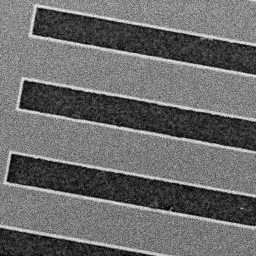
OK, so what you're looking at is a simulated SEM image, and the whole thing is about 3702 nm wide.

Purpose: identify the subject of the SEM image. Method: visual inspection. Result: one or a few lines or trenches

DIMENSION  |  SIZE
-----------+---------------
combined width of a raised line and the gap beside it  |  1080 nm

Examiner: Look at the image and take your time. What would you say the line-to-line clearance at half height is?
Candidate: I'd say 452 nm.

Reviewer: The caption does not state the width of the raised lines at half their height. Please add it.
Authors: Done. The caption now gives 0.628 micrometres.